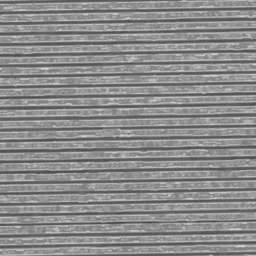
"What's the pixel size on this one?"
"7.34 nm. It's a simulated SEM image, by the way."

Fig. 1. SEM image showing parallel lines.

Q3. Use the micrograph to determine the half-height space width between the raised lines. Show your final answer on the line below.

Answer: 26.6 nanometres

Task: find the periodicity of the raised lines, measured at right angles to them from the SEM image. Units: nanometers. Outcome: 78.1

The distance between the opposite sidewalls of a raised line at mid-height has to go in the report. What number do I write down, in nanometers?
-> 52.3